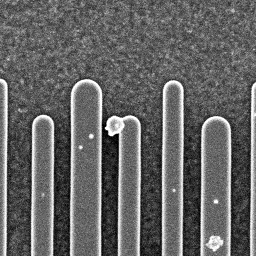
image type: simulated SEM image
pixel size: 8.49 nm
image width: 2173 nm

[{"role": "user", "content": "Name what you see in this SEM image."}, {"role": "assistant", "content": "groups of lines, slits or small figures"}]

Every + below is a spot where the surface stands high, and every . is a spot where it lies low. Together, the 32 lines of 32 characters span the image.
................................
................................
................................
................................
................................
................................
................................
................................
................................
................................
+.........++.........+..........
+........++++........++.........
+........++++........++.........
+........++++........++.........
+....+...++++.......+++.........
+...+++..++++++++...+++...+++...
+...+++..++++.+++...+++..++++...
+...+++..++++..++...+++..++++..+
+...+++..++++..++...+++..++++..+
+...+++..++++..++...+++..++++..+
+...+++..++++..++...+++..++++..+
+...+++..++++..++...+++..++++..+
+...+++..++++..++...+++..++++..+
+...+++..++++..++...+++..++++..+
+...+++..++++..++...+++..++++..+
+...+++..++++..++...+++..++++..+
+...+++..++++..++...+++..++++..+
+...+++..++++..++...+++..++++..+
+...+++..++++..++...+++..++++..+
+...+++..++++..++...+++..++++..+
+...+++..++++..++...+++..++++..+
+...+++..++++..++...+++..++++..+